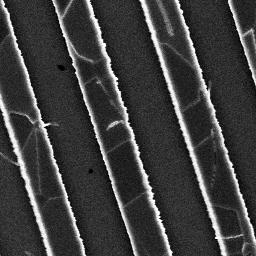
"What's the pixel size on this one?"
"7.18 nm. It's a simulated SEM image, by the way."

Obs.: lines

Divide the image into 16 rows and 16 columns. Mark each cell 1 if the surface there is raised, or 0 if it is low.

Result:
0001110001100011
1000110001110001
1000110000110001
1000111000110001
1100011000111000
1100011000011000
1100011100011000
1110001100011100
0110001100001100
0110001110001100
0111000110001110
0011000110000110
0011000111000110
0011100011000111
0001100011000011
0001100011100011